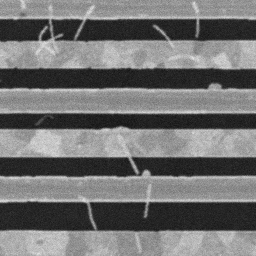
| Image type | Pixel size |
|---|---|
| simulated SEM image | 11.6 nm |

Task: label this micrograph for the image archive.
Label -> lines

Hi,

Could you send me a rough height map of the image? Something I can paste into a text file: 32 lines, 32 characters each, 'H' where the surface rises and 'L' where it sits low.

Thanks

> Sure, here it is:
HHHHHHHHHHHHHHHHHHHHHHHHHHHHHHHH
HHHHHHHHHHHHHHHHHHHHHHHHHHHHHHHH
LLLLLLLLLLLLLLLLLLLLLLLLLLLLLLLL
LLLLLLLLLLLLLLLLLLLLLLLLLLLLLLLL
LLLLLLLLLLLLLLLLLLLLLLLLLLLLLLLL
HHHHHHHHHHHHHHHHHHHHHHHHHHHHHHHH
HHHHHHHHHHHHHHHHHHHHHHHHHHHHHHHH
HHHHHHHHHHHHHHHHHHHHHHHHHHHHHHHH
LLHLLLLLLLLHHHLLHHHLLLLLLLLHHHHH
LLLLLLLLLLLLLLLLLLLLLLLLLLLLLLLL
LLLLLLLLLLLLLLLLLLLLLLLLLLLLLLLL
HHHHHHHHHHHHHHHHHHHHHHHHHHHHHHHH
HHHHHHHHHHHHHHHHHHHHHHHHHHHHHHHH
HHHHHHHHHHHHHHHHHHHHHHHHHHHHHHHH
LLLLLLLLLLLLLLLLLLLLLLLLLLLLLLLL
LLLLLLLLLLLLLLLLLLLLLLLLLLLLLLLL
HHHHHHHHHHHHHHHHHHHHHHHHHHHHHHHH
HHHHHHHHHHHHHHHHHHHHHHHHHHHHHHHH
HHHHHHHHHHHHHHHHHHHHHHHHHHHHHHHH
LLLLLLLLLLLLLLLLHLLLLLLLLLLLLLLL
LLLLLLLLLLLLLLLLLLLLLLLLLLLLLLLL
LLLLLLLLLLLLLLLLLLLLLLLLLLLLLLLL
HHHHHHHHHHHHHHHHHHHHHHHHHHHHHHHH
HHHHHHHHHHHHHHHHHHHHHHHHHHHHHHHH
HHHHHHHHHHHHHHHHHHHHHHHHHHHHHHHH
LLLLLLLLLLLLLLLLLLLLLLLLLLLLLLLL
LLLLLLLLLLLLLLLLLLLLLLLLLLLLLLLL
LLLLLLLLLLLLLLLLLLLLLLLLLLLLLLLL
LLLLLLLLLLLLLLLLLLLLLLLLLLLLLLLL
HHHHHHHHHHHHHHHHHHHHHHHHHHHHHHHH
HHHHHHHHHHHHHHHHHHHHHHHHHHHHHHHH
HHHHHHHHHHHHHHHHHHHHHHHHHHHHHHHH